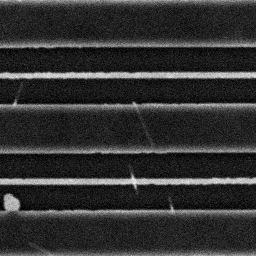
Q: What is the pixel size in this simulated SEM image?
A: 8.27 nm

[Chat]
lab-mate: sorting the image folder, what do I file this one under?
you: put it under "lines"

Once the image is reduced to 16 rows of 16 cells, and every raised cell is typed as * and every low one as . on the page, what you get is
****************
****************
****************
................
................
................
................
****************
****************
***********.....
................
................
*...............
****************
****************
****************